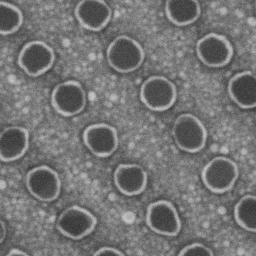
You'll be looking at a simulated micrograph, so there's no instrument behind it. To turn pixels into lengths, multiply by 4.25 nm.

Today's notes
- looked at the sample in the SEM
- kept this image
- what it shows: a regular array of raised bodies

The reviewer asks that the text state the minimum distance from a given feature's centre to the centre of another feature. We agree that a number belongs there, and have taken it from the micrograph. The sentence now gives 217 nanometres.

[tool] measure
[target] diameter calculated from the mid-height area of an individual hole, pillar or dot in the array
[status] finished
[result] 144 nm